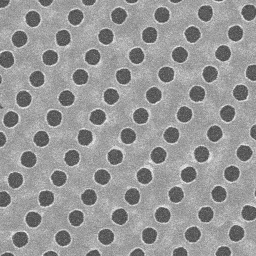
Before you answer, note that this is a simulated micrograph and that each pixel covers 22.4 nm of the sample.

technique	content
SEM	a regular array of holes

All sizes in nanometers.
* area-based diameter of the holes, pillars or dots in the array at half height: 371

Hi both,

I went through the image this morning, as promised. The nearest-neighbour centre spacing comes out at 537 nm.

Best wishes